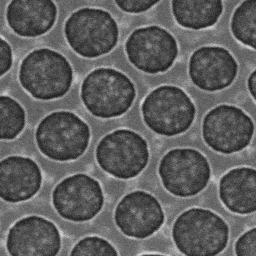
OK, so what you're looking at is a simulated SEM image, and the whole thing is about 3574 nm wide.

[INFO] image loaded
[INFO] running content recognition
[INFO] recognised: a regular array of holes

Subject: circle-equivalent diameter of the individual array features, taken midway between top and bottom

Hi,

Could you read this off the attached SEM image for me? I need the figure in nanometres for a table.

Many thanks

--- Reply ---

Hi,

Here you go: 708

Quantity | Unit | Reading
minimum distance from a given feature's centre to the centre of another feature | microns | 0.867